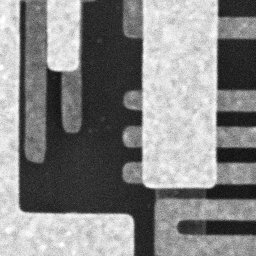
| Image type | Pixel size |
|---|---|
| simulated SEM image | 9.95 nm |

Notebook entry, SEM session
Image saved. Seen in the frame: wiring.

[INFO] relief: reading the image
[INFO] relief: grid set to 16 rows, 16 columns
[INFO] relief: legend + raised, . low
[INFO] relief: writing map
+..++....+++++..
+..++....+++++..
+..++....+++++..
+..++....+++++..
+........+++++..
+........+++++..
+........++++...
+........++++...
+........++++...
+........++++...
+........++++...
+........++++...
+...............
++++++++........
++++++++........
++++++++........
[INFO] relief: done